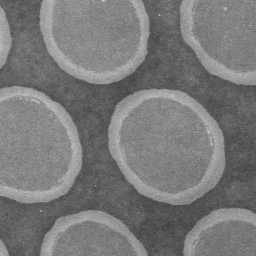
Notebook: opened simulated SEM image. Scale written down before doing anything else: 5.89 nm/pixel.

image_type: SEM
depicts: raised bodies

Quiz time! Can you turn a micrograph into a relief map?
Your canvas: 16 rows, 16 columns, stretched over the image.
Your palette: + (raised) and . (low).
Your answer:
...++++++...++++
...++++++...++++
...++++++...++++
....+++++....+++
.....+++......++
................
+++.....++++....
++++...++++++...
+++++..+++++++..
+++++..+++++++..
+++++...+++++...
++++.....++++...
................
.....+.......++.
...+++++....++++
...++++++...++++